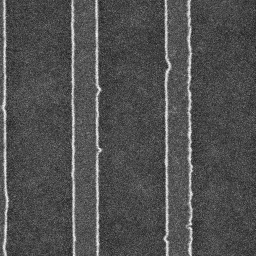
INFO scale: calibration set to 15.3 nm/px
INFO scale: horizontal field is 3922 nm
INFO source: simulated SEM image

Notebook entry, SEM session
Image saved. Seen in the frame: one or a few lines or trenches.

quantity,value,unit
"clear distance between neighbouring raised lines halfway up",67.6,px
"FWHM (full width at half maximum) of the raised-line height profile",379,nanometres